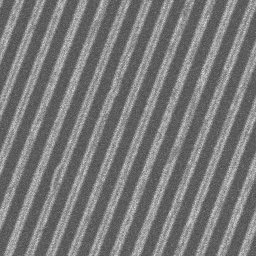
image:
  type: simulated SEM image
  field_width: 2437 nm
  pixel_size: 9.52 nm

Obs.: parallel lines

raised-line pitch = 189 nanometres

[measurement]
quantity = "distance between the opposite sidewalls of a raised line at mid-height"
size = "0.0645 µm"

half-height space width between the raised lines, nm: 119